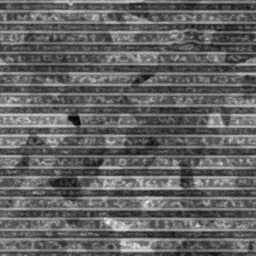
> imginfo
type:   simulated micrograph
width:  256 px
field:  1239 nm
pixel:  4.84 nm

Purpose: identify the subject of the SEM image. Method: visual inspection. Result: parallel lines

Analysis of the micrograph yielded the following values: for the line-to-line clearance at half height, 9.01 pixels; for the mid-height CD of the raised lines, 11.7 pixels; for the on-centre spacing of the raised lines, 100 nm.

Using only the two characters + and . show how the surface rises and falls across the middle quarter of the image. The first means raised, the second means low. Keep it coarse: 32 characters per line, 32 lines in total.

................................
................................
++++++++++++++++++++++++........
++++++++++++++++++++++++++++++++
++++++++++++++++++++++++++++++++
................................
................................
................................
++++++++++++++++++++++++++++++++
++++++++++++++++++++++++++++++++
................................
................................
................................
++++++++++++++++++++++++++++++++
++++++++++++++++++++++++++++++++
........................++++++++
................................
................................
++++++++++++++++++++++++++++++++
++++++++++++++++++++++++++++++++
++++++++++++++++++++++++++++++++
................................
................................
++++++++++++++++++++++++++++++++
++++++++++++++++++++++++++++++++
++++++++++++++++++++++++++++++++
................................
................................
++++++++++++++++++++++++++++++++
++++++++++++++++++++++++++++++++
++++++++++++++++++++++++++++++++
................................